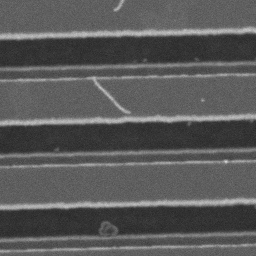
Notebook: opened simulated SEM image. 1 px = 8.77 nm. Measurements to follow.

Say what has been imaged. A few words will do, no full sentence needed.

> lines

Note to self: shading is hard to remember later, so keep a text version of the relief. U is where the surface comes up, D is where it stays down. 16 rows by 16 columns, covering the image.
UUUUUUUUUUUUUUUU
UUUUUUUUUUUUUUUU
DDDDDDDDDDDDDDDD
DDDDDDDDDDDDDDDD
UUUUUUUUUUUUUUUU
UUUUUUUUUUUUUUUU
UUUUUUUUUUUUUUUU
UUUUUUUUUUUUUUDD
DDDDDDDDDDDDDDDD
DDDDDDDDDDDDDUUU
UUUUUUUUUUUUUUUU
UUUUUUUUUUUUUUUU
UUUUUUUUUUUUUUUU
DDDDDDDDDDDDDDDD
DDDDDDDDDDDDDDDD
UUUUUUUUUUUUUUUU